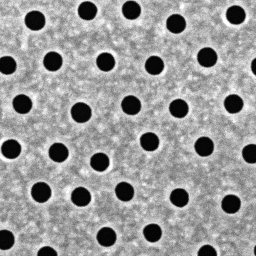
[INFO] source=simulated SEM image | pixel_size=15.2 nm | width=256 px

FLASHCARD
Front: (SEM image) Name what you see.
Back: a regular array of holes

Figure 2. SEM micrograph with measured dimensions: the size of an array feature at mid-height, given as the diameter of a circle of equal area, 308 nanometers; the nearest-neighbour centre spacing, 696 nanometers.